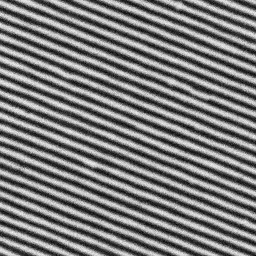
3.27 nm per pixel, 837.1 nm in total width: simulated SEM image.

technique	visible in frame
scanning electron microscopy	parallel lines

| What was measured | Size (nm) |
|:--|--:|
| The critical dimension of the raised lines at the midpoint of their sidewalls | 16.7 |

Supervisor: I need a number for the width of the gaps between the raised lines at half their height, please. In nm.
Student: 19.4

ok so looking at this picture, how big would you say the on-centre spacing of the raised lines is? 34.2 nm